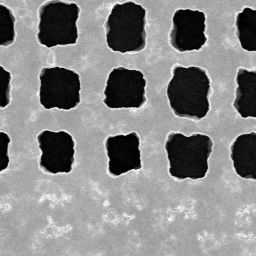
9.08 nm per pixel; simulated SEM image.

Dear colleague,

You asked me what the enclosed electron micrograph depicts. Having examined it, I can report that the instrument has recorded a regular array of holes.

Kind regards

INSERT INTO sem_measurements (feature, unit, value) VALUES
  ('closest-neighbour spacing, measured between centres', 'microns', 0.57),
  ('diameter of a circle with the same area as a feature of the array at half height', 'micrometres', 0.393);